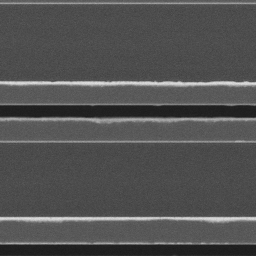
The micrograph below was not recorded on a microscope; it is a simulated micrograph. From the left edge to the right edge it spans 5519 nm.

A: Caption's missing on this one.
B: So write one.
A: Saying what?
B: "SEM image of lines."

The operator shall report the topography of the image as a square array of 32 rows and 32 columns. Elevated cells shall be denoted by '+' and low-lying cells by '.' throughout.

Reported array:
................................
................................
................................
................................
................................
................................
................................
................................
................................
................................
++++++++++++++++++++++++++++++++
++++++++++++++++++++++++++++++++
++++++++++++++++++++++++++++++++
................................
................................
++++++++++++++++++++++++++++++++
++++++++++++++++++++++++++++++++
++++++++++++++++++++++++++++++++
................................
................................
................................
................................
................................
................................
................................
................................
................................
++++++++++++++++++++++++++++++++
++++++++++++++++++++++++++++++++
++++++++++++++++++++++++++++++++
................................
................................